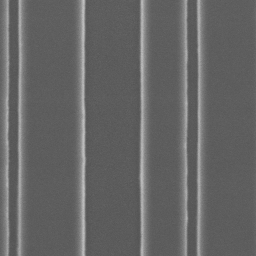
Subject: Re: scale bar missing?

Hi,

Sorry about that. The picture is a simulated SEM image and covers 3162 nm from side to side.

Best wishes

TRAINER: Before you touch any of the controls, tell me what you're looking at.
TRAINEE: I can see lines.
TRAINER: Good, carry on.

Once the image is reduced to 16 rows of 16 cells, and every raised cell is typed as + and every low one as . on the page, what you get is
+++++....+++++++
+++++....+++++++
+++++....+++++++
+++++....+++++++
+++++....+++++++
+++++....+++++++
+++++....+++++++
+++++....+++++++
+++++....+++++++
+++++....+++++++
+++++....+++++++
+++++....+++++++
+++++....+++++++
+++++....+++++++
+++++....+++++++
+++++....+++++++